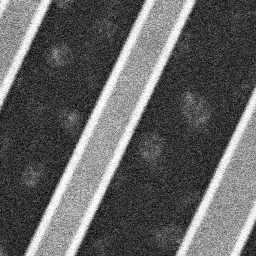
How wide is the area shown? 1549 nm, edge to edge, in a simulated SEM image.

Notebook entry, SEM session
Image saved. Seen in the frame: one or a few lines or trenches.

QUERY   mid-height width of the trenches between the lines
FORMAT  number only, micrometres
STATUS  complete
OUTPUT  0.605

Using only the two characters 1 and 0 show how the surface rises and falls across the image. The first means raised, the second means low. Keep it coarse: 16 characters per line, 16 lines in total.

1110000001110000
1100000001100000
1100000011100000
1000000011000000
1000000111000000
0000000110000000
0000001110000000
0000001100000001
0000011100000001
0000011000000011
0000111000000011
0000110000000111
0001110000000111
0001110000001111
0001100000001110
0011100000001110